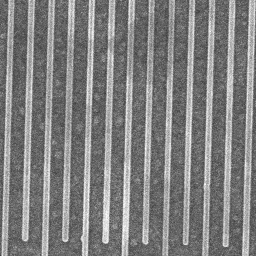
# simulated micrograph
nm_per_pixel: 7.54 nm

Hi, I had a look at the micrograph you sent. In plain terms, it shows parallel lines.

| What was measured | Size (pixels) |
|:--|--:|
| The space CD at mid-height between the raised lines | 14.6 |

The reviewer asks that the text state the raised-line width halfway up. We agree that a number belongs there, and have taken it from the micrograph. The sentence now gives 0.0405 micrometres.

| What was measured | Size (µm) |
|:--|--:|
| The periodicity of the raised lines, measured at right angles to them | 0.151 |